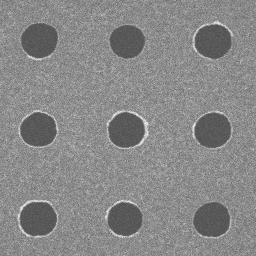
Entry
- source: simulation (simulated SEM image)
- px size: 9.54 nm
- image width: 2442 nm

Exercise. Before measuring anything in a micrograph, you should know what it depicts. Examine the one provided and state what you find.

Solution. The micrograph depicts a regular array of holes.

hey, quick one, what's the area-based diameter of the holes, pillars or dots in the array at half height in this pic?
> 0.342 microns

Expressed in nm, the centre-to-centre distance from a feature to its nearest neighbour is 830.